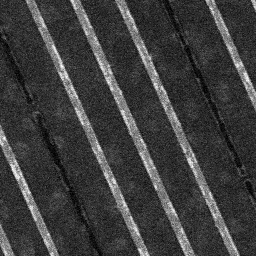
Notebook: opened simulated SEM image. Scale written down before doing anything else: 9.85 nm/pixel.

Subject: parallel lines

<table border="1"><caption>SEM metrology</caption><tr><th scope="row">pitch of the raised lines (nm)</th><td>405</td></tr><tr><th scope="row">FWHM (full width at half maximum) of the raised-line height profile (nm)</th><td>76.4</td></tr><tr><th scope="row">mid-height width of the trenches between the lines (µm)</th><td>0.329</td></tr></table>